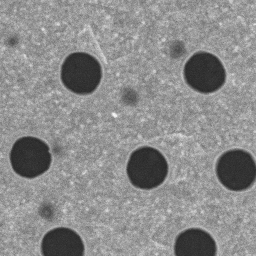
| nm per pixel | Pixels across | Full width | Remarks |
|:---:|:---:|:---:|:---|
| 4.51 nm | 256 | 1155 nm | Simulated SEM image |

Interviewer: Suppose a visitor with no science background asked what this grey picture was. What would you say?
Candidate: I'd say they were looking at holes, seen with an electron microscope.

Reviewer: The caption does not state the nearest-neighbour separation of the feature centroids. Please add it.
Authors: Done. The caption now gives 473 nm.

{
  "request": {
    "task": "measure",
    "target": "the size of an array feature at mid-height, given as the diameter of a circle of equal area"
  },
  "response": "191 nanometres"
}